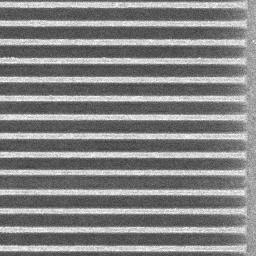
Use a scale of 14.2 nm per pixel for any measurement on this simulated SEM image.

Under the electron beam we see parallel lines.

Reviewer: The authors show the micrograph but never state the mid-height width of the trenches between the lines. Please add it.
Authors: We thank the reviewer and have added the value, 168 nanometers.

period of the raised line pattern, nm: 266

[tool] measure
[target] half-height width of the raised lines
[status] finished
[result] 99.2 nm